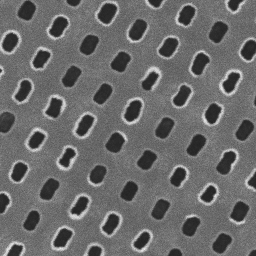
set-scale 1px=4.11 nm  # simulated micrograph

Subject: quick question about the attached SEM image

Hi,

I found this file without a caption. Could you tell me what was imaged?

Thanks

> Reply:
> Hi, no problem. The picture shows a regular array of holes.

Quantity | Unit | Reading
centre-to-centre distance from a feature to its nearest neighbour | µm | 0.145